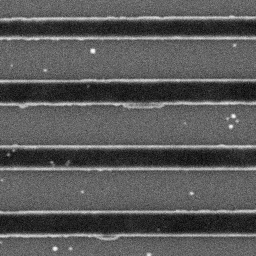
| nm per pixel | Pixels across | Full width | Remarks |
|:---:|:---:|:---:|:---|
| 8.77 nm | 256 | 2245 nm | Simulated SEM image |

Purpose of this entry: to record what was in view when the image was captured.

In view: lines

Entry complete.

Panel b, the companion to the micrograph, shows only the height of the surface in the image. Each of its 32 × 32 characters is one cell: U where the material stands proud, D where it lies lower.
DDDDDDDDDDDDDDDDDDDDDDDDDDDDDDDD
DDDDDDDDDDDDDDDDDDDDDDDDDDDDDDDD
UUUUUUUUUUUUUUUUUUUUUUUUUUUUUUUU
UUUUUUUUUUUUUUUUUUUUUUUUUUUUUUUU
UUUUUUUUUUUUUUUUUUUUUUUUUUUUUUUU
DDDDDDDDDDDDDDDDDDDDDDDDDDDDDDDD
DDDDDDDDDDDDDDDDDDDDDDDDDDDDDDDD
DDDDDDDDDDDDDDDDDDDDDDDDDDDDDDDD
DDDDDDDDDDDDDDDDDDDDDDDDDDDDDDDD
DDDDDDDDDDDDDDDDDDDDDDDDDDDDDDDD
UUUUUUUUUUUUUUUUUUUUUUUUUUUUUUUU
UUUUUUUUUUUUUUUUUUUUUUUUUUUUUUUU
UUUUUUUUUUUUUUUUUUUUUUUUUUUUUUUU
DDDDDDDDDDDDDDDDDDDDDDDDDDDDDDDD
DDDDDDDDDDDDDDDDDDDDDDDDDDDDDDDD
DDDDDDDDDDDDDDDDDDDDDDDDDDDDDDDD
DDDDDDDDDDDDDDDDDDDDDDDDDDDDDDDD
DDDDDDDDDDDDDDDDDDDDDDDDDDDDDDDD
UUUUUUUUUUUUUUUUUUUUUUUUUUUUUUUU
UUUUUUUUUUUUUUUUUUUUUUUUUUUUUUUU
UUUUUUUUUUUUUUUUUUUUUUUUUUUUUUUU
DDDDDDDDDDDDDDDDDDDDDDDDDDDDDDDD
DDDDDDDDDDDDDDDDDDDDDDDDDDDDDDDD
DDDDDDDDDDDDDDDDDDDDDDDDDDDDDDDD
DDDDDDDDDDDDDDDDDDDDDDDDDDDDDDDD
DDDDDDDDDDDDDDDDDDDDDDDDDDDDDDDD
DDDUUUUUUUUUUUUUUUUUUUUUUUUUUUUU
UUUUUUUUUUUUUUUUUUUUUUUUUUUUUUUU
UUUUUUUUUUUUUUUUUUUUUUUUUUUUUUUU
UDUUUUUDUDDDUUUDDDDDDDDDDDDDDDDD
DDDDDDDDDDDDDDDDDDDDDDDDDDDDDDDD
DDDDDDDDDDDDDDDDDDDDDDDDDDDDDDDD